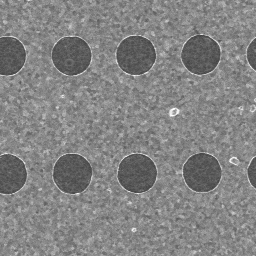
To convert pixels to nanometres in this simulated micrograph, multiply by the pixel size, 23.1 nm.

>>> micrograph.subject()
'holes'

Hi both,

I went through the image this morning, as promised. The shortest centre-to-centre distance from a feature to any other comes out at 1500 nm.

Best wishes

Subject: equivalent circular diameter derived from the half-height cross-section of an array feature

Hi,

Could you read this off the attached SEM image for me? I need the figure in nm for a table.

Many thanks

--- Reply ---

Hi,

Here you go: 907